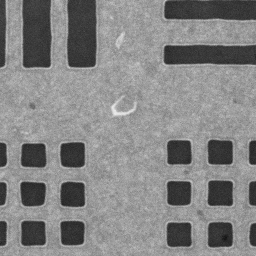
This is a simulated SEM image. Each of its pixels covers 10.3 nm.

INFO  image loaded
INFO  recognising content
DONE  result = groups of lines, slits or small figures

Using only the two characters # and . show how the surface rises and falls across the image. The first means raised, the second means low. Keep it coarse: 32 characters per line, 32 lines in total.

.##...##....#########...........
.##...##....########............
.##...##....##########....##....
.##...##....####################
.##....#....####################
.##...##....############..######
.##...##....########............
.##...##....########............
###...###..#####################
################################
################################
################################
################################
################################
################################
################################
################################
######################.###..####
.##...##...##########...##...##.
.##...#....##########...##...##.
.##...##...##########...##...##.
################################
###########################.####
.#....##...##########...##...##.
.##...#....##########...##...##.
.##..###...##########...##...##.
################################
###.############################
.##...##...##########...##...##.
.##...##...##########...##...##.
.##...##..###########...##...##.
################################